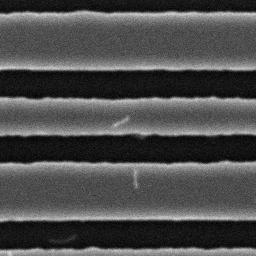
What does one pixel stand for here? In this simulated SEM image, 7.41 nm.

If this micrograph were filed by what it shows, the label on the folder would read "lines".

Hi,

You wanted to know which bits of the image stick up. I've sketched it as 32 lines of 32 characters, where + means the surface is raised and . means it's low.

................................
..........+.....................
++++++++++++++++++++++++++++++++
++++++++++++++++++++++++++++++++
++++++++++++++++++++++++++++++++
++++++++++++++++++++++++++++++++
++++++++++++++++++++++++++++++++
++++++++++++++++++++++++++++++++
++++++++++++++++++++++++++++++++
................................
................................
................................
++++++++++++++++++++++++++++++++
++++++++++++++++++++++++++++++++
++++++++++++++++++++++++++++++++
++++++++++++++++++++++++++++++++
++++++++++++++++++++++++++++++++
................................
................................
................................
+++.++++++++++++++++++++++++++++
++++++++++++++++++++++++++++++++
++++++++++++++++++++++++++++++++
++++++++++++++++++++++++++++++++
++++++++++++++++++++++++++++++++
++++++++++++++++++++++++++++++++
++++++++++++++++++++++++++++++++
+++++.++..+..................+..
................................
................................
................................
++++++++++++++++++++++++++++++++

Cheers